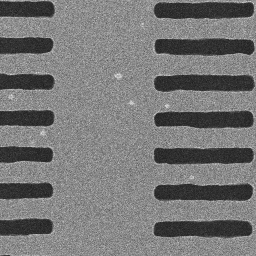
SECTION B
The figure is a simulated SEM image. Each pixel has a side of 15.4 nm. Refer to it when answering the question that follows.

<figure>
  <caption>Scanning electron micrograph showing holes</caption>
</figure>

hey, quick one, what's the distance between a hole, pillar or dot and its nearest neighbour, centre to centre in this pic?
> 558 nm